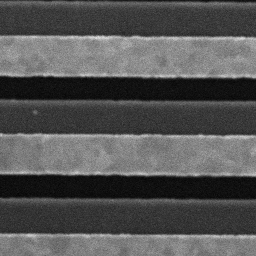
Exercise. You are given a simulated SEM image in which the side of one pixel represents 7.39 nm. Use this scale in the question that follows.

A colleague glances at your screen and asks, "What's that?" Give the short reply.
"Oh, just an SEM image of lines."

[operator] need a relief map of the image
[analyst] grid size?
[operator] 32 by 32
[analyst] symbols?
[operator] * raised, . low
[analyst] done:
********************************
********************************
********************************
********************************
********************************
********************************
********************************
********************************
********************************
.*******************************
................................
................................
................................
********************************
********************************
********************************
********************************
********************************
********************************
********************************
********************************
********************************
................................
................................
................................
********************************
********************************
********************************
********************************
********************************
********************************
********************************